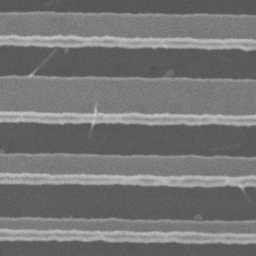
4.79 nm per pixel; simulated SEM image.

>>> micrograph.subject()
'lines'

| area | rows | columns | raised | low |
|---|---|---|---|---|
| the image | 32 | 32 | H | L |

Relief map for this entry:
LLLLLLLLLLLLLLLLLLLLLLLLLLLLLLLL
LLLLLLLLLLLLLLLLLLLLLLLLLLLLLLLL
HHHHHHHHHHHHHHHHHHHHHHHHHHHHHHHH
HHHHHHHHHHHHHHHHHHHHHHHHHHHHHHHH
HHHHHHHHHHHHHHHHHHHHHHHHHHHHHHHH
HHHHHHHHHHHHHHHHHHHHHHHHHHHHHHHH
LLLLLLLLLLLLLLLLLLLLLLLLLLLLLLLL
LLLLLLLLLLLLLLLLLLLLLLLLLLLLLLLL
LLLLLLLLLLLLLLLLLLLLLLLLLLLLLLLL
LLLHHLLLLLLLLLLLLLLLLLLLLLLLLLLL
HHHHHHHHHHHHHHHHHHHHHHHHHHHHHHHH
HHHHHHHHHHHHHHHHHHHHHHHHHHHHHHHH
HHHHHHHHHHHHHHHHHHHHHHHHHHHHHHHH
HHHHHHHHHHHHHHHHHHHHHHHHHHHHHHHH
HHHHHHHHHHHHHHHHHHHHHHHHHHHHHHHH
LLLLLLLHLLLHLLLLLHHHHHHHHHHHHHHH
LLLLLLLLLLLLLLLLLLLLLLLLLLLLLLLL
LLLLLLLLLLLLLLLLLLLLLLLLLLLLLLLL
LLLLLLLLLLLLLLLLLLLLLLLLLLLLLLLL
HHHHHHHHHHHHHHHLHHHHLLHHHLLLLLLL
HHHHHHHHHHHHHHHHHHHHHHHHHHHHHHHH
HHHHHHHHHHHHHHHHHHHHHHHHHHHHHHHH
HHHHHHHHHHHHHHHHHHHHHHHHHHHHHHHH
LLLLLLLLLLLLLLLLLLLLLLLLLLLLLLLL
LLLLLLLLLLLLLLLLLLLLLLLLLLLLLLLL
LLLLLLLLLLLLLLLLLLLLLLLLLLLLLLLL
LLLLLLLLLLLLLLLLLLLLLLLLLLLLLLLL
HHHHHHHHHHHHHHHLLLLLLLLLLLLLLLLL
HHHHHHHHHHHHHHHHHHHHHHHHHHHHHHHH
HHHHHHHHHHHHHHHHHHHHHHHHHHHHHHHH
LLLLLLLLLLLLLLLLLLLLLLLLLLLLLLLL
LLLLLLLLLLLLLLLLLLLLLLLLLLLLLLLL